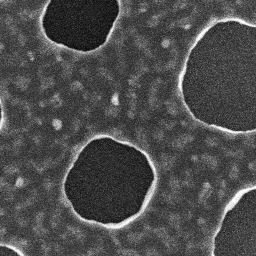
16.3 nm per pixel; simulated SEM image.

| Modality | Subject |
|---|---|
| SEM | holes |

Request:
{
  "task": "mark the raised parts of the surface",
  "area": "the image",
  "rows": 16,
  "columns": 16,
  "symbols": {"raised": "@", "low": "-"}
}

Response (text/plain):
@@@----@@@@@@@@@
@@@----@@@@@@--@
@@@----@@@@@----
@@@@@@@@@@@@----
@@@@@@@@@@@-----
@@@@@@@@@@@-----
@@@@@@@@@@@@----
@@@@@@@@@@@@----
@@@@@@@@@@@@@@@@
@@@@@----@@@@@@@
@@@@-----@@@@@@@
@@@@------@@@@@@
@@@@-----@@@@@@-
@@@@@---@@@@@@--
@@@@@@@@@@@@@@--
-@@@@@@@@@@@@---